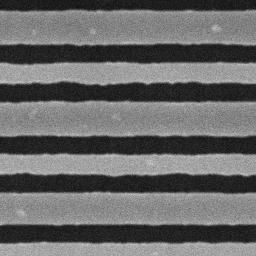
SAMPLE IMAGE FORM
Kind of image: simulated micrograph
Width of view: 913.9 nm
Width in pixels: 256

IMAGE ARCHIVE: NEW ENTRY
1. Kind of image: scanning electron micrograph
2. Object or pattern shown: lines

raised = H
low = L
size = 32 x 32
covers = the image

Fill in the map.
LLLLLLLLLLLLLLLLLLLLLLLLLLLLLLLL
HHHHHHHHHHHHHHHHHHHHHHHHHHHHHHHH
HHHHHHHHHHHHHHHHHHHHHHHHHHHHHHHH
HHHHHHHHHHHHHHHHHHHHHHHHHHHHHHHH
HHHHHHHHHHHHHHHHHHHHHHHHHHHHHHHH
LLLLLLLLLHHHLHLLLLLLLLLLLLLLLLHH
LLLLLLLLLLLLLLLLLLLLLLLLLLLLLLLL
LLLLLLLLLLLLLLLLLLLLLLLLLLLLLLLL
HHHHHHHHHHHHHHHHHHHHHHHHHHHHHHHH
HHHHHHHHHHHHHHHHHHHHHHHHHHHHHHHH
LHLLLLLLLLHHHHHLLLLLLLLLLLLLLLLL
LLLLLLLLLLLLLLLLLLLLLLLLLLLLLLLL
LLLLLLLLLLLLLLLLLLLLLLLLLLLLLLLL
HHHHHHHHHHHHHHHHHHHHHHHHHHHHHHHH
HHHHHHHHHHHHHHHHHHHHHHHHHHHHHHHH
HHHHHHHHHHHHHHHHHHHHHHHHHHHHHHHH
HHHHHHHHHHHHHHHHHHHHHHHHHHHHHHHH
LLLLLLLLLLLLLLLLLLLLLLLLLLLLLLLL
LLLLLLLLLLLLLLLLLLLLLLLLLLLLLLLL
HHHHHHHHHHHHHHHHHHHHHHHHHHHHHHHH
HHHHHHHHHHHHHHHHHHHHHHHHHHHHHHHH
HHHHHHHHHHHHHHHHHHHHHHHHHHHHHHHH
LLLLLLLLLLLLLLLLLLLLLLLLLLLLLLLL
LLLLLLLLLLLLLLLLLLLLLLLLLLLLLLLL
HHHHHHHHHHHHHHHHHHHHHHHHHHHHHHHH
HHHHHHHHHHHHHHHHHHHHHHHHHHHHHHHH
HHHHHHHHHHHHHHHHHHHHHHHHHHHHHHHH
HHHHHHHHHHHHHHHHHHHHHHHHHHHHHHHH
LLLLLLLLLLLLLLLLLLLLLLLLLLLLLLLL
LLLLLLLLLLLLLLLLLLLLLLLLLLLLLLLL
LLHHHHHHHHHHHHHHHHHHHLLHHHHHHHHH
HHHHHHHHHHHHHHHHHHHHHHHHHHHHHHHH